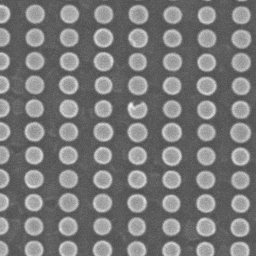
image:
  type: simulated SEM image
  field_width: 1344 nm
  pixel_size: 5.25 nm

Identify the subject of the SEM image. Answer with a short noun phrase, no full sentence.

a regular array of raised bodies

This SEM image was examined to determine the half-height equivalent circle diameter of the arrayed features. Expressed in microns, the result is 0.0908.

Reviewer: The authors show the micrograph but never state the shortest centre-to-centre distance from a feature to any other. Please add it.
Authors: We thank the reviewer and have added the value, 123 nanometres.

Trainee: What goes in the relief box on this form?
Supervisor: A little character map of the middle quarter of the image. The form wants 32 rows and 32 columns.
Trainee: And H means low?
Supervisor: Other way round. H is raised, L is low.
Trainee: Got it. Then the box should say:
HHHLLLLLHHHHLLLLLHHHLLLLLHHHHLLL
LLLLLLLLLLLLLLLLLLHLLLLLLLHHLLLL
LLLLLLLLLLLLLLLLLLLLLLLLLLLLLLLL
HHLLLLLLLHHLLLLLLHHHLLLLLLLLLLLL
HHHLLLLLHHHHLLLLHHHHHLLLLHHHHLLL
HHHLLLLLHHHHLLLLHHHHHLLLLHHHHLLL
HHHLLLLLHHHLLLLLLHHHHLLLLHHHHLLL
LLLLLLLLLLLLLLLLLLHLLLLLLLLLLLLL
LLLLLLLLLLLLLLLLLLLLLLLLLLLLLLLL
HHHLLLLLLHHLLLLLLLLLLLLLLLHHLLLL
HHHLLLLLHHHHLLLLHLHHLLLLLHHHHLLL
HHHLLLLLHHHHLLLLHHHHLLLLLHHHHLLL
HHHLLLLLHHHLLLLLLHHHLLLLLHHHHLLL
LLLLLLLLLLLLLLLLLLLLLLLLLLLLLLLL
LLLLLLLLLLLLLLLLLLLLLLLLLLLLLLLL
HHHLLLLLHHHLLLLLLHHHLLLLLHHHLLLL
HHHLLLLLHHHHLLLLHHHHLLLLLHHHHLLL
HHHLLLLLHHHHLLLLHHHHHLLLLHHHHLLL
HHHLLLLLHHHLLLLLLHHHLLLLLHHHHLLL
LLLLLLLLLLLLLLLLLLLLLLLLLLLLLLLL
LLLLLLLLLLLLLLLLLLLLLLLLLLLLLLLL
HHHLLLLLHHHLLLLLLHHHLLLLLHHHHLLL
HHHLLLLLHHHHLLLLHHHHLLLLLHHHHLLL
HHHLLLLLHHHHLLLLHHHHLLLLLHHHHLLL
HHLLLLLLLHHLLLLLLHHHLLLLLHHHHLLL
LLLLLLLLLLLLLLLLLLLLLLLLLLLLLLLL
LLLLLLLLLLLLLLLLLLLLLLLLLLLLLLLL
HHHLLLLLHHHLLLLLLHHHLLLLLHHHHLLL
HHHLLLLLHHHHLLLLHHHHLLLLLHHHHLLL
HHHLLLLLHHHHLLLLHHHHLLLLLHHHHLLL
HHLLLLLLHHHLLLLLLHHHLLLLLLHHLLLL
LLLLLLLLLLLLLLLLLLLLLLLLLLLLLLLL